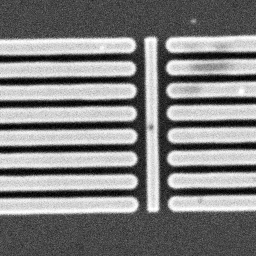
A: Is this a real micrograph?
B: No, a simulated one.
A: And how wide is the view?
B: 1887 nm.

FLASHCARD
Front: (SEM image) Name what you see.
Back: groups of lines, slits or small figures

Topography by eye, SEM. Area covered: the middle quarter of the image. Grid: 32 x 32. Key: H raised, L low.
HHHHHHHHHHHHHHHHHHLLLHHLLLHHHHHH
HHHHHHHHHHHHHHHHHHLLLHHLLLHHHHHH
HHHHHHHHHHHHHHHHHLLLLHHLLLLHHHHH
LLLLLLLLLLLLLLLLLLLLLHHLLLLLLLLL
LLLLLLLLLLLLLLLLLLLLLHHLLLLLLLLL
HHHHHHHHHHHHHHHHHLLLLHHLLLHHHHHH
HHHHHHHHHHHHHHHHHHLLLHHLLLHHHHHH
HHHHHHHHHHHHHHHHHHLLLHHLLLHHHHHH
HHHHHHHHHHHHLLLLLLLLLHHLLLLLLLLL
LLLLLLLLLLLLLLLLLLLLLHHLLLLLLLLL
LLLLLLLLLLLLLLLLLLLLLHHLLLLLLLLL
HHHHHHHHHHHHHHHHHHLLLHHLLLHHHHHH
HHHHHHHHHHHHHHHHHHLLLHHLLLHHHHHH
HHHHHHHHHHHHHHHHHLLLLHHLLLLHHHHH
LLLLLLLLLLLLLLLLLLLLLHHLLLLLLLLL
LLLLLLLLLLLLLLLLLLLLLHHLLLLLLLLL
LLLLLLLLLLLLLLHHHLLLLHHLLLLHHHHH
HHHHHHHHHHHHHHHHHHLLLHHLLLHHHHHH
HHHHHHHHHHHHHHHHHHLLLHHLLLHHHHHH
HHHHHHHHHHHHHHHHHLLLLHHLLLLHHHHH
LLLLLLLLLLLLLLLLLLLLLHHLLLLLLLLL
LLLLLLLLLLLLLLLLLLLLLHHLLLLLLLLL
HHHHHHHHHHHHHHHHHLLLLHHLLLLHHHHH
HHHHHHHHHHHHHHHHHHLLLHHLLLHHHHHH
HHHHHHHHHHHHHHHHHHLLLHHLLLHHHHHH
HHHHHHHHHHHHHLLLLLLLLHHLLLLLLLLL
LLLLLLLLLLLLLLLLLLLLLHHLLLLLLLLL
LLLLLLLLLLLLLLLLLLLLLHHLLLLLLLLL
HHHHHHHHHHHHHHHHHHLLLHHLLLHHHHHH
HHHHHHHHHHHHHHHHHHLLLHHLLLHHHHHH
HHHHHHHHHHHHHHHHHHLLLHHLLLLHHHHH
LLLLLLLLLLLLLLLLLLLLLHHLLLLLLLLL